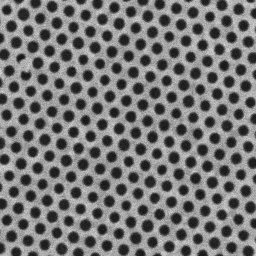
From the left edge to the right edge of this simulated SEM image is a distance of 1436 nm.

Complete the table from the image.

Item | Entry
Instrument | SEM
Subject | a regular array of holes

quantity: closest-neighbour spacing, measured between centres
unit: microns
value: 0.0936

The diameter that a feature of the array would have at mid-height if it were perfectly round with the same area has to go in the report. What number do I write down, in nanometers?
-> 62.6